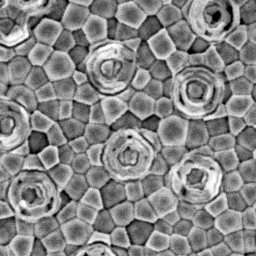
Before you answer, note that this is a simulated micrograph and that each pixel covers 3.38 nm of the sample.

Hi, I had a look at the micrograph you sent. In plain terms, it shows ring-shaped raised bodies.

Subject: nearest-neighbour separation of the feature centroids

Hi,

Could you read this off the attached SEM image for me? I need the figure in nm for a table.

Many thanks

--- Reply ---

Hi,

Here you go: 176